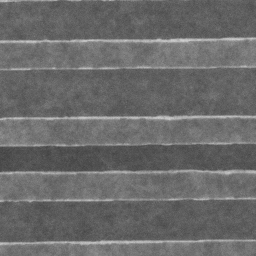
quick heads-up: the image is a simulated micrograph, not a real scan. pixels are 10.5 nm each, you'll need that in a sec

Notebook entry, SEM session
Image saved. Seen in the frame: lines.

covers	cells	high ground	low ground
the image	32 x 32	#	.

................................
................................
................................
................................
................................
################################
################################
################################
###############.................
................................
................................
................................
................................
................................
................................
################################
################################
################################
................................
................................
................................
....................#######.####
################################
################################
################################
................................
................................
................................
................................
................................
################################
################################